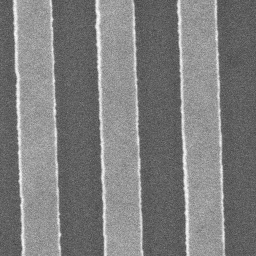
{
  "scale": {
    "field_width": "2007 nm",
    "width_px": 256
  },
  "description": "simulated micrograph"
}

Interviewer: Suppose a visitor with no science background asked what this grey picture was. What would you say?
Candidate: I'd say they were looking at lines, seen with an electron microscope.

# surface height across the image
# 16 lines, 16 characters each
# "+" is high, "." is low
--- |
.++...++...+++..
.++...++...+++..
.++...++...+++..
.++...++...+++..
.++...+++..+++..
.++...+++..+++..
.++...+++..+++..
.++...+++..+++..
.+++..+++..+++..
.+++..+++..+++..
.+++..+++..+++..
.+++..+++...++..
.+++..+++...++..
.+++..+++...++..
.+++..+++...++..
.+++...++...++..